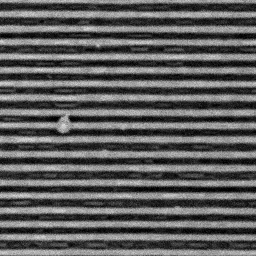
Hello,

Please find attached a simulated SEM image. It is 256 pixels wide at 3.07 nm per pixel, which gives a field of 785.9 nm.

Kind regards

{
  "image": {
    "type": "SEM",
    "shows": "parallel lines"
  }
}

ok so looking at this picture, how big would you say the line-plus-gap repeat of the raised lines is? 42.9 nanometres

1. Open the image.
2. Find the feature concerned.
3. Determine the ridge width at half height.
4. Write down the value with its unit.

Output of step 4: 18.4 nm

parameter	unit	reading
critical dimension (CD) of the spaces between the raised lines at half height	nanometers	26.1